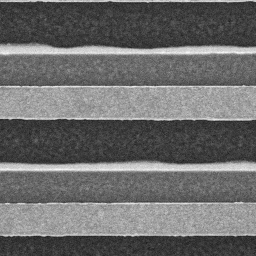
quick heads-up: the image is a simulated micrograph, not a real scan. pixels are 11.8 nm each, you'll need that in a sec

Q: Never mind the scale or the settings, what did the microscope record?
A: lines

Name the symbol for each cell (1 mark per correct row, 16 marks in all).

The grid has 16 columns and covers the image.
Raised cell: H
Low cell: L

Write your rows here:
LLLLLLLLLLLLLLLL
LLLLLLLLLLLLLLLL
LLLLLLLLLLLLLLLL
HHHHHHHHHHHHHHHH
HHHHHHHHHHHHHHHH
HHHHHHHHHHHHHHHH
HHHHHHHHHHHHHHHH
LLLLLLLLLLLLLLLL
LLLLLLLLLLLLLLLL
LLLLLLLLLLLLLLLL
LLLLLLLLLLLLLLLL
HHHHHHHHHHHHHHHH
HHHHHHHHHHHHHHHH
HHHHHHHHHHHHHHHH
HHHHHHHHHHHHHHHH
LLLLLLLLLLLLLLLL